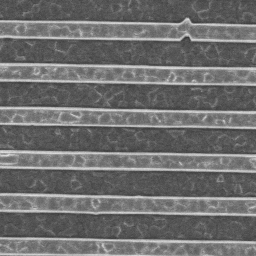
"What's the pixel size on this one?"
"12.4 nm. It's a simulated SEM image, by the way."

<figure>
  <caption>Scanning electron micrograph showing parallel lines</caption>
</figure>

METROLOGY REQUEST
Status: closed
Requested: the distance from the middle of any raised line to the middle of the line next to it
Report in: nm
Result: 539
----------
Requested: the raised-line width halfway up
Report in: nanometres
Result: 203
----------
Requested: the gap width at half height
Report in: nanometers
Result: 336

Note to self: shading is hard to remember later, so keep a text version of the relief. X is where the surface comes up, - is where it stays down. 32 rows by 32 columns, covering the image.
--------------------------------
--------------------------------
--------------------------------
XXXXXXXXXXXXXXXXXXXXXXXXXXXXXXXX
XXXXXXXXXXXXXXXXXXXXXXXXXXXXXXXX
--------------------------------
--------------------------------
--------------------------------
XXXXXXXXXXXXXXXXXXXXXXXX--------
XXXXXXXXXXXXXXXXXXXXXXXXXXXXXXXX
----------------------XXXXXXXXXX
--------------------------------
--------------------------------
---XX---------------------------
XXXXXXXXXXXXXXXXXXXXXXXXXXXXXXXX
---XXXXXXXXXXXXXXXXXXXXXXXXXXXXX
--------------------------------
--------------------------------
--------------------------------
XXXXXXXXXXXXXXXXXXXXXXXXXXXXXXXX
XXXXXXXXXXXXXXXXXXXXXXXXXXXXXXXX
--------------------------------
--------------------------------
--------------------------------
XXXXXXXX------------------------
XXXXXXXXXXXXXXXXXXXXXXXXXXXXXXXX
----------XXXXXXXXXXXXXXXXXXXXXX
--------------------------------
--------------------------------
--------------------------------
XXXXXXXXXXXXXXXXXXXXXXXXXXXXXXXX
XXXXXXXXXXXXXXXXXXXXXXXXXXXXXXXX